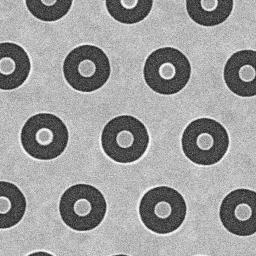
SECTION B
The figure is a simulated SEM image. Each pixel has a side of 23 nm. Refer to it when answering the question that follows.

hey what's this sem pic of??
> an array of small figures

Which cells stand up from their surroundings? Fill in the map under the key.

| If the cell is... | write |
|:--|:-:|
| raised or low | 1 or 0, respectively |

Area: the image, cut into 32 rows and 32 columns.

11100010011110011001111001100111
11110000011110000001111000000111
11111001111111000011111100001111
11111111111111111111111111111111
11111111111111111111111111111111
00111111111111111111111111111111
00011111100001111110000111111000
10001111000000111100000011110000
11001111001100111100110011110011
00001111000000111100110011110011
00011111100001111100000111110000
11111111110111111110001111111000
11111111111111111111111111111111
11111111111111111111111111111111
11110001111111100111111111111111
11100000111110000011111100001111
11100100011110010001111000001111
11000100111110011001111001100111
11100000111110000001111001000111
11110001111110000011111000001111
11111111111111111111111100011111
11111111111111111111111111111111
11111111111111111111111111111111
00111111100011111110011111111101
00011111000001111100000111110000
10011110001001111000100111110000
10011110001001111001100111100110
00011111000001111100000111110000
01111111100011111100001111110000
11111111111111111111111111111101
11111111111111111111111111111111
11110011111111111111111111111111